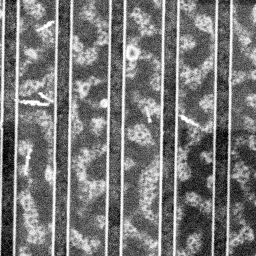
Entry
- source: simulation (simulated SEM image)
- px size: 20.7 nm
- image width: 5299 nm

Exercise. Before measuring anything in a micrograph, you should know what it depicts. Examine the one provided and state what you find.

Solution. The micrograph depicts parallel lines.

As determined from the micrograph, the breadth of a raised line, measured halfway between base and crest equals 792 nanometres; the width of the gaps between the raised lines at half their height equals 15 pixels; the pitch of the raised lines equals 1.1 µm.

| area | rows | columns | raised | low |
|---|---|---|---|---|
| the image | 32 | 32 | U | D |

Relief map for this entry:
DDUUUUUDDUUUUUDDUUUUDDUUUUUDDUUU
DDUUUUUDDUUUUUDDUUUUDDUUUUUDDUUU
DDUUUUUDDUUUUUDDUUUUDDUUUUUDDUUU
DDUUUUUDDUUUUUDDUUUUDDUUUUUDDUUU
DDUUUUUDDUUUUUDDUUUUDDUUUUUDDUUU
DDUUUUUDDUUUUUDDUUUUDDUUUUUDDUUU
DDUUUUUDDUUUUUDDUUUUDDUUUUUDDUUU
DDUUUUUDDUUUUUDDUUUUDDUUUUUDDUUU
DDUUUUUDDUUUUUDDUUUUDDUUUUUDDUUU
DDUUUUUDDUUUUUDDUUUUDDUUUUUDDUUU
DDUUUUUDDUUUUUDDUUUUDDUUUUUDDUUU
DDUUUUUDDUUUUUDDUUUUDDUUUUUDDUUU
DDUUUUUDDUUUUUDDUUUUDDUUUUUDDUUU
DDUUUUUDDUUUUUDUUUUUDDUUUUUDDUUU
DDUUUUUDDUUUUUDUUUUUDDUUUUUDDUUU
DDUUUUUDDUUUUDDUUUUUDDUUUUUDDUUU
DDUUUUUDDUUUUDDUUUUUDDUUUUUDDUUU
DDUUUUUDDUUUUDDUUUUUDDUUUUUDDUUU
DDUUUUUDDUUUUDDUUUUUDDUUUUUDDUUU
DDUUUUUDDUUUUDDUUUUUDDUUUUUDDUUU
DDUUUUUDDUUUUDDUUUUUDDUUUUUDDUUU
DDUUUUUDDUUUUDDUUUUUDDUUUUUDDUUU
DDUUUUUDDUUUUDDUUUUUDDUUUUUDDUUU
DDUUUUUDDUUUUDDUUUUUDDUUUUUDDUUU
DDUUUUUDDUUUUDDUUUUUDDUUUUUDDUUU
DDUUUUUDDUUUUDDUUUUUDDUUUUUDDUUU
DDUUUUUDDUUUUDDUUUUUDDUUUUUDDUUU
DDUUUUUDDUUUUDDUUUUUDDUUUUUDDUUU
DDUUUUUDDUUUUDDUUUUUDDUUUUUDDUUU
DDUUUUUDDUUUUDDUUUUUDDUUUUUDDUUU
DDUUUUUDDUUUUDDUUUUUDDUUUUUDDUUU
DDUUUUUDDUUUUDDUUUUUDDUUUUUDDUUU